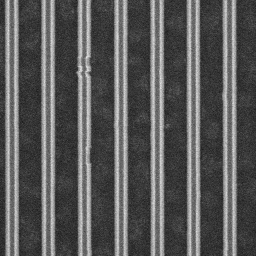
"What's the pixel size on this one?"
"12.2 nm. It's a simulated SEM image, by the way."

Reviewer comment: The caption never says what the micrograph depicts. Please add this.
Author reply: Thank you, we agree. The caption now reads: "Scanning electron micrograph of parallel lines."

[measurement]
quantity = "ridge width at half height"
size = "118 nm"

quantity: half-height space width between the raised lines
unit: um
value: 0.322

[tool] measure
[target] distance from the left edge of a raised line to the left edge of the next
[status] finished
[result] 444 nanometres